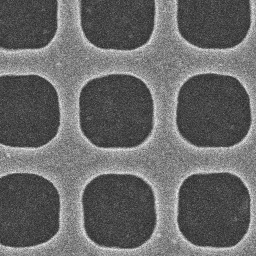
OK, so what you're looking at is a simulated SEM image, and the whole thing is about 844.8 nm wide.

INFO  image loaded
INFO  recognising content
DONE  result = holes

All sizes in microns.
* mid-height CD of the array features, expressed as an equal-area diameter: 0.259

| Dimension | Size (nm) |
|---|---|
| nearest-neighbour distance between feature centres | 316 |